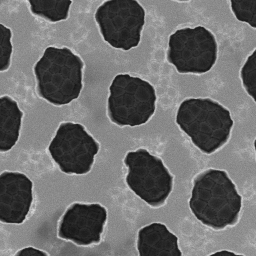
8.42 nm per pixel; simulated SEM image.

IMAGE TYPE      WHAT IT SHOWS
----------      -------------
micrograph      a regular array of holes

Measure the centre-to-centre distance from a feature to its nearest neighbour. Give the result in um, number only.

0.626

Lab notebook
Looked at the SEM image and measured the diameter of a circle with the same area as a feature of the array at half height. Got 412 nm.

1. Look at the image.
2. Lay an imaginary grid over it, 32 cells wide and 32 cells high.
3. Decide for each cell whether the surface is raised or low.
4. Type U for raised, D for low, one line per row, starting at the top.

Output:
UUUUDDDDDUUUUDDDDUUUUUUUUUUUUDDD
UUUUDDDDUUUUDDDDDDUUUUUUUUUUUDDD
UUUUUUDDUUUUDDDDDDUUUUUUUUUUUUDD
DUUUUUUUUUUUUDDDDDUUUUUUDUUUUUUU
DUUUUUUUUUUUUDDDDUUUUDDDDDDUUUUU
DUUUUUUUUUUUUUDDDUUUUDDDDDDUUUUU
DUUUUUDDDUUUUUUUUUUUUDDDDDDUUUUU
DUUUUDDDDDUUUUUUUUUUUDDDDDDUUUUD
DUUUDDDDDDUUUUUUUUUUUUDDDDUUUUDD
UUUUUDDDDDUUUUUDUUUUUUUUUUUUUUDD
UUUUUDDDDDUUUUDDDDDUUUUUUUUUUUUD
UUUUUDDDDDUUUUDDDDDUUUUUUUUUUUUD
DUUUUUDDDUUUUUDDDDDUUUUUDDUUUUUU
DDUUUUUUUUUUUUDDDDDUUUDDDDDDUUUU
DDDUUUUUUUUUUUDDDDDUUUDDDDDDDUUU
DDDUUUUUDDUUUUUDDDUUUUDDDDDDDUUU
DDUUUUUDDDDUUUUUUUUUUUUDDDDDDUUU
DDUUUUUDDDDDUUUUUUUUUUUUDDDDUUUU
DUUUUUDDDDDDUUUUUUUUUUUUUDDUUUUU
UUUUUUDDDDDDUUUUDDDUUUUUUUUUUUUU
UUUUUUUDDDDUUUUUDDDDUUUUUUUUUUUU
UUUUUUUUDDDUUUUUDDDDDUUUUUDDUUUU
DDDDUUUUUUUUUUUUDDDDDUUUUDDDDUUU
DDDDUUUUUUUUUUUUDDDDDUUUDDDDDUUU
DDDDUUUUUUUUUUUUUDDDDUUUDDDDDDUU
DDDDUUUUUUUUUUUUUUUDUUUUDDDDDDUU
DDDUUUUUDDDDDUUUUUUUUUUUDDDDDDUU
DDDUUUUUDDDDDUUUUUUUUUUUUDDDDUUU
UUUUUUUUDDDDDUUUUUDDDUUUUUUUUUUU
UUUUUUUUDDDDUUUUUDDDDDUUUUUUUUUU
UUUUUUUUUUDUUUUUUDDDDDUUUUUUUUUU
UUDDDUUUUUUUUUUUUDDDDDDUUUUDDUUU